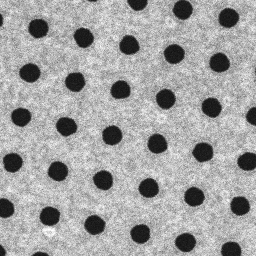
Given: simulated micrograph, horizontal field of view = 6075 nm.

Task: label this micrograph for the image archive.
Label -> a regular array of holes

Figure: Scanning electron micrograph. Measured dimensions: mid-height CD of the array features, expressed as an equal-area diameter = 483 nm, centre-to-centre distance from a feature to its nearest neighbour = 1.08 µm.